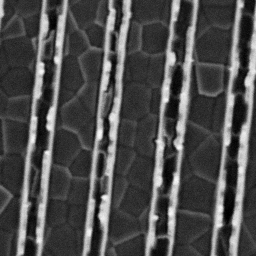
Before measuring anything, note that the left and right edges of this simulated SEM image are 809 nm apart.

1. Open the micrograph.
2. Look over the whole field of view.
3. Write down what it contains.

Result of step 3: one or a few lines or trenches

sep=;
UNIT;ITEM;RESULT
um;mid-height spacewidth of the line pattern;0.138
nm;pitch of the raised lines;204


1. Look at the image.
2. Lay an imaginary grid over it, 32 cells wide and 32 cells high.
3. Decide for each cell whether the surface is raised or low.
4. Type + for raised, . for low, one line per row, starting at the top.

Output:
.....+++......++......+++.....++
.....+++......++......++......++
.....+++......++.....+++......++
.....+++.....+++.....+++......++
.....+++.....+++.....+++.....+++
.....+++.....+++.....+++.....+++
.....+++.....++......+++.....+++
.....+++.....++......+++.....+++
.....++......++......+++.....+++
.....++......++......+++.....+++
....+++......++......+++.....+++
....+++......++.....+++......++.
....+++......++.....+++......++.
....+++.....+++.....+++.....+++.
....+++.....+++.....+++.....+++.
....+++.....+++.....+++.....+++.
....+++.....++......+++.....+++.
....++......++......+++.....+++.
....++......++......+++.....+++.
....++......++......+++.....+++.
...+++......++......++......+++.
...+++......++.....+++......++..
...+++.....+++.....+++......++..
...+++.....+++.....+++.....+++..
...+++.....+++.....+++.....+++..
...+++.....+++.....+++.....+++..
...+++.....++......+++.....+++..
...++......++......+++.....+++..
...++......++......+++.....+++..
...++......++......+++.....+++..
..+++......++.....++++.....+++..
..+++......++.....+++......++...